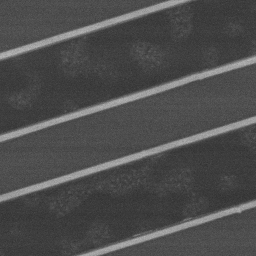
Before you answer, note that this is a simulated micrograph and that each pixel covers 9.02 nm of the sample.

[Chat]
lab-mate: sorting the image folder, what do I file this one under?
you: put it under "one or a few lines or trenches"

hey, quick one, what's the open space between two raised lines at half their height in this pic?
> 514 nm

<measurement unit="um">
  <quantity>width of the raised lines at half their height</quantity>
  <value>0.719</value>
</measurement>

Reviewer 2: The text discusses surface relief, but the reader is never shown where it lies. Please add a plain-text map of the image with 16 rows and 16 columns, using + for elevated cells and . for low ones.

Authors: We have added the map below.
..........++++++
.......+++++++++
...+++++++++++++
++++++++++++++++
+++++++++++++...
++++++++++......
+++++++.........
++++............
+............+++
.........+++++++
......++++++++++
...+++++++++++++
++++++++++++++++
+++++++++++++...
++++++++++......
+++++++.........